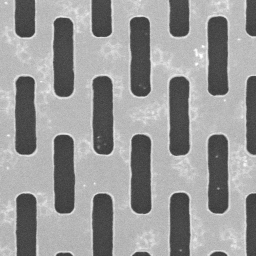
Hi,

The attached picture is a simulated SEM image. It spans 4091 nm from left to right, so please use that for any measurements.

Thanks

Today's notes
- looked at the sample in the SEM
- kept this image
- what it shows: a regular array of holes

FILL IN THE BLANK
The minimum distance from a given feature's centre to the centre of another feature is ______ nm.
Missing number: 1110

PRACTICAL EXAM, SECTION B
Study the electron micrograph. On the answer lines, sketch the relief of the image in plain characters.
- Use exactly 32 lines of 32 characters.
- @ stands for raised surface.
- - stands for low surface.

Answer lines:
@@--@@@@@@@---@@@@@@@---@@@@@@@-
@@--@@@@@@@---@@@@@@@---@@@@@@@-
@@--@@@--@@---@@--@@@---@@--@@@-
@@--@@@--@@---@@---@@---@@---@@-
@@--@@@--@@@-@@@---@@@-@@@---@@-
@@@@@@@--@@@@@@@---@@@@@@@---@@@
@@@@@@@--@@@@@@@---@@@@@@@---@@@
@@@@@@@--@@@@@@@---@@@@@@@---@@@
@@@@@@@--@@@@@@@---@@@@@@@---@@@
@@@-@@@--@@@@@@@---@@@-@@@---@@@
@@--@@@--@@@--@@---@@---@@---@@-
@@--@@@--@@---@@---@@---@@--@@@-
@@--@@@@@@@---@@@@@@@---@@@@@@@-
@@--@@@@@@@---@@@@@@@---@@@@@@@-
@@---@@@@@@---@@@@@@@---@@@@@@@-
@@---@@@@@@---@@@@@@@---@@@@@@@-
@@---@@@@@@---@@@@@@@---@@@@@@@-
@@---@@--@@---@@@--@@---@@--@@@-
@@--@@@--@@@--@@---@@---@@---@@-
@@@@@@@--@@@@@@@---@@@-@@@---@@@
@@@@@@@--@@@@@@@---@@@@@@@---@@@
@@@@@@@--@@@@@@@---@@@@@@@---@@@
@@@@@@@--@@@@@@@---@@@@@@@---@@@
@@@@@@@--@@@@@@@---@@@@@@@---@@@
@@--@@@--@@@--@@---@@@--@@---@@-
@@---@@--@@@--@@---@@---@@---@@-
@@---@@--@@@--@@@--@@---@@--@@@-
@@---@@@@@@@--@@@@@@@---@@@@@@@-
@@---@@@@@@@--@@@@@@@---@@@@@@@-
@@---@@@@@@@--@@@@@@@---@@@@@@@-
@@---@@@@@@@--@@@@@@@---@@@@@@@-
@@---@@@@@@@--@@@-@@@---@@@-@@@-